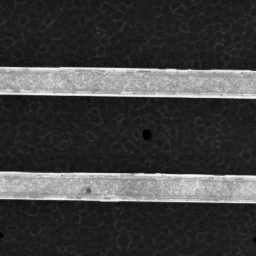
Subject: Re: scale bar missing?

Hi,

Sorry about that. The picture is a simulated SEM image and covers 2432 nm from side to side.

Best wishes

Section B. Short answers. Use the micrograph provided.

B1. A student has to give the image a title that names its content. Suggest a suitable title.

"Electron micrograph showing one or a few lines or trenches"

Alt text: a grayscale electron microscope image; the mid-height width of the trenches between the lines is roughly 747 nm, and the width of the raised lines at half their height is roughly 246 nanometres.